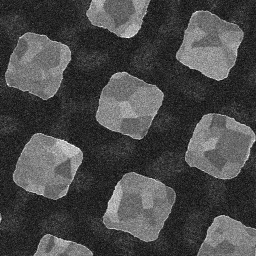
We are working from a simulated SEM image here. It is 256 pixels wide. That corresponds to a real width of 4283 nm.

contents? raised bodies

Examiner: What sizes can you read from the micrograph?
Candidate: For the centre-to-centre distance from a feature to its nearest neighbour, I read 1680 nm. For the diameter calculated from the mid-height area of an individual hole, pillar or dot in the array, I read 62.7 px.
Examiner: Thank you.